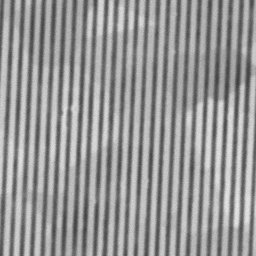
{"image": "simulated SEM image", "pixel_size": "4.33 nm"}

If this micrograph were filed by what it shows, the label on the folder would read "parallel lines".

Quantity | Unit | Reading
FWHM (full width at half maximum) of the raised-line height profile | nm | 16.2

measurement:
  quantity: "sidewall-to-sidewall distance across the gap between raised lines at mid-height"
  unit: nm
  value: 28.7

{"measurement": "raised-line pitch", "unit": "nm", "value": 45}